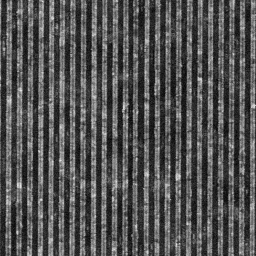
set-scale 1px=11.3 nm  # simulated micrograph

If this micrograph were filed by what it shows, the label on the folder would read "parallel lines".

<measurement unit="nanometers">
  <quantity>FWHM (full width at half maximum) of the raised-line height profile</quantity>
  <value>41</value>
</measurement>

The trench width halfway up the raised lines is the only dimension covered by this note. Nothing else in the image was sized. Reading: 80.6 nm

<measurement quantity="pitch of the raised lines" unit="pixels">10.6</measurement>